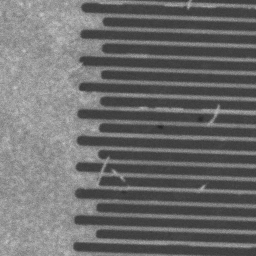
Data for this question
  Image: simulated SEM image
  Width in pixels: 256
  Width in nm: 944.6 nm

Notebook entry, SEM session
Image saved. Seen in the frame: parallel lines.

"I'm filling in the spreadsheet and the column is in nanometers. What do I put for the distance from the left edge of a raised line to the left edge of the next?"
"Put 48.9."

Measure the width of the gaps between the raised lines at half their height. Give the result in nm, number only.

36.4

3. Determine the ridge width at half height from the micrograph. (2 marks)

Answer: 12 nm